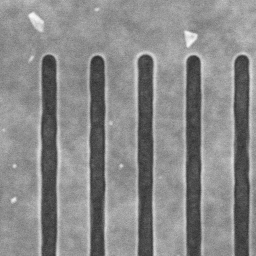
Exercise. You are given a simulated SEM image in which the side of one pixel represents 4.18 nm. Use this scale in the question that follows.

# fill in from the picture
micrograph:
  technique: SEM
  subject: groups of lines, slits or small figures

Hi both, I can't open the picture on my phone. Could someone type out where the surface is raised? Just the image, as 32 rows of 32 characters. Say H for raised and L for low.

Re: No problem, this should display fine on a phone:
HHHHHHHHHHHHHHHHHHHHHHHHHHHHHHHH
HHHHHHHHHHHHHHHHHHHHHHHHHHHHHHHH
HHHHHHHHHHHHHHHHHHHHHHHHHHHHHHHH
HHHHHHHHHHHHHHHHHHHHHHHHHHHHHHHH
HHHHHHHHHHHHHHHHHHHHHHHHHHHHHHHH
HHHHHHHHHHHHHHHHHHHHHHHHHHHHHHHH
HHHHHHHHHHHHHHHHHHHHHHHHHHHHHHHH
HHHHHLLHHHHLLHHHHLLHHHHLLHHHHLLH
HHHHHLLHHHHLLHHHHLLHHHHLLHHHHLLH
HHHHHLLHHHHLLHHHHLLHHHHLLHHHHLLH
HHHHHLLHHHHLLHHHHLLHHHHLLHHHHLLH
HHHHHLLHHHHLLHHHHLLHHHHLLHHHHLLH
HHHHHLLHHHHLLHHHHLLHHHHLLHHHHLLH
HHHHHLLHHHHLLHHHHLLHHHHLLHHHHLLH
HHHHHLLHHHHLLHHHHLLHHHHLLHHHHLLH
HHHHHLLHHHHLLHHHHLLHHHHLLHHHHLLH
HHHHHLLHHHHLLHHHHLLHHHHLLHHHHLLH
HHHHHLLHHHHLLHHHHLLHHHHLLHHHHLLH
HHHHHLLHHHHLLHHHHLLHHHHLLHHHHLLH
HHHHHLLHHHHLLHHHHLLHHHHLLHHHHLLH
HHHHHLLHHHHLLHHHHLLHHHHLLHHHHLLH
HHHHHLLHHHHLLHHHHLLHHHHLLHHHHLLH
HHHHHLLHHHHLLHHHHLLHHHHLLHHHHLLH
HHHHHLLHHHHLLHHHHLLHHHHLLHHHHLLH
HHHHHLLHHHHLLHHHHLLHHHHLLHHHHLLH
HHHHHLLHHHHLLHHHHLLHHHHLLHHHHLLH
HHHHHLLHHHHLLHHHHLLHHHHLLHHHHLLH
HHHHHLLHHHHLLHHHHLLHHHHLLHHHHLLH
HHHHHLLHHHHLLHHHHLLHHHHLLHHHHLLH
HHHHHLLHHHHLLHHHHLLHHHHLLHHHHLLH
HHHHHLLHHHHLLHHHHLLHHHHLLHHHHLLH
HHHHHLLHHHHLLHHHHLLHHHHLLHHHHLLH